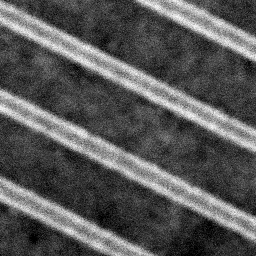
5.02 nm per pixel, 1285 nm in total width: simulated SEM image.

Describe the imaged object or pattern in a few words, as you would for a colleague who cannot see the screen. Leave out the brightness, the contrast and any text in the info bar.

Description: one or a few lines or trenches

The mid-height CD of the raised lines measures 0.0749 microns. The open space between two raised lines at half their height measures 321 nanometers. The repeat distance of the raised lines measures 79.1 px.